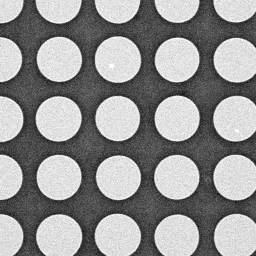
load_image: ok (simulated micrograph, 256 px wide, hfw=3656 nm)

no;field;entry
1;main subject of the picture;an array of small figures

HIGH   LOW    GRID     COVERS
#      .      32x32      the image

###..#####..#####..######..#####
##...#####..#####...####...#####
#.....###....###.....##.....###.
................................
................................
##...####....####...####....###.
###..#####..#####...#####..#####
###..#####..#####..######..#####
##...#####..#####...#####..#####
##....###....####...####....####
................................
................................
#.....###....###.....###....###.
##...#####..#####...#####..#####
###..#####..#####..######..#####
###..#####..#####..######..#####
##...#####...####...####...#####
#.....##......#......##......#..
................................
#......#.............##......#..
##...#####...####...####...#####
###..#####..#####..######..#####
###..#####..######.######..#####
##...#####..#####...#####..#####
#.....###....###.....###....###.
................................
................................
##....###....####...####....###.
###..#####..#####...#####..#####
###..#####..######.######..#####
###..#####..#####...#####..#####
##...####....####...####...#####